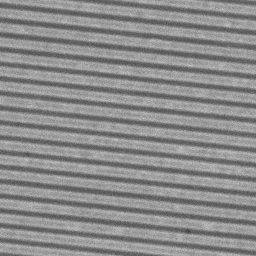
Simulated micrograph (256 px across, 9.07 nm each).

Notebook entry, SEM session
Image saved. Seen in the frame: parallel lines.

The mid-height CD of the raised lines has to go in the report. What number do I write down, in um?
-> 0.0619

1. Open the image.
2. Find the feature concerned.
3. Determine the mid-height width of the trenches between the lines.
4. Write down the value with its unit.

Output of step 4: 69.9 nanometers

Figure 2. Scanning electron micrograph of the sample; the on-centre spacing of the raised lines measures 0.132 micrometres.